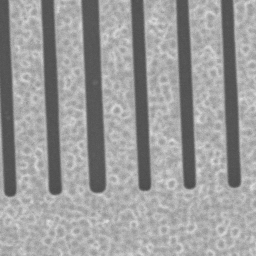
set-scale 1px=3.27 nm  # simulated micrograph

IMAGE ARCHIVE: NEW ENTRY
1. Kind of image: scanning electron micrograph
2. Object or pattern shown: parallel lines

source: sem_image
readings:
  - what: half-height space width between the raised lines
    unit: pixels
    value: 13.7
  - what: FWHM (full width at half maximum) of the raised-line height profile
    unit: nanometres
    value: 105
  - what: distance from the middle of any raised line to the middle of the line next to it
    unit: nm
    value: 147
